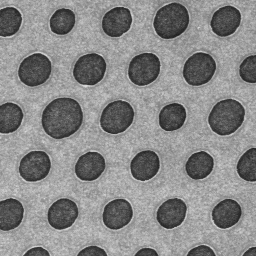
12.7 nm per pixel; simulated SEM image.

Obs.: a regular array of holes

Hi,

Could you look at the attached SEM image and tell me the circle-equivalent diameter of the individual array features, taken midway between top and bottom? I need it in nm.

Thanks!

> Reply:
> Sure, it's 398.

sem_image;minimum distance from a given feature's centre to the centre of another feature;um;0.693